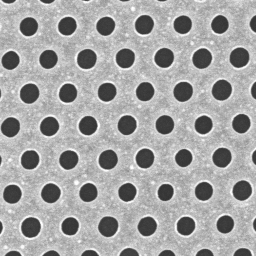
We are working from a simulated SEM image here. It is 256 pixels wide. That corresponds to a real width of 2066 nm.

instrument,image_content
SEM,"a regular array of holes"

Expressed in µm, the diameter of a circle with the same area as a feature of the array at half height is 0.154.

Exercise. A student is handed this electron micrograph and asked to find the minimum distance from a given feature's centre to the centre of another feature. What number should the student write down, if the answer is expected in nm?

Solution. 306